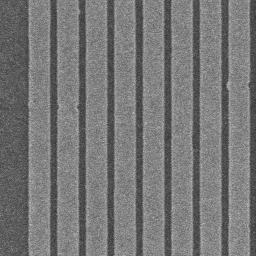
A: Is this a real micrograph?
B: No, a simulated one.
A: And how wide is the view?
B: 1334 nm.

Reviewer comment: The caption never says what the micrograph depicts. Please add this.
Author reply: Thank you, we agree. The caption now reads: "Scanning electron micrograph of parallel lines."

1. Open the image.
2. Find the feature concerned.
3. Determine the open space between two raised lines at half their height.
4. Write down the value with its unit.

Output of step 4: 37.8 nm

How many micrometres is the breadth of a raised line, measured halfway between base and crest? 0.112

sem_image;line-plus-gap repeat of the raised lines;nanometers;149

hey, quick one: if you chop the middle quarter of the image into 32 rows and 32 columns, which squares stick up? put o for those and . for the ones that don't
oooo..ooooo..ooooo..ooooo..ooooo
oooo..ooooo..ooooo..ooooo..ooooo
oooo..ooooo..ooooo..ooooo..ooooo
oooo..ooooo..ooooo..ooooo..ooooo
oooo..ooooo..ooooo..ooooo..ooooo
oooo..ooooo..ooooo..ooooo..ooooo
oooo..ooooo..ooooo..ooooo..ooooo
oooo..ooooo..ooooo..ooooo..ooooo
oooo..ooooo..ooooo..ooooo..ooooo
oooo..ooooo..ooooo..ooooo..ooooo
ooo...ooooo..ooooo..ooooo..ooooo
oooo..ooooo..ooooo..ooooo..ooooo
oooo..ooooo..ooooo..ooooo..ooooo
oooo..ooooo..ooooo..ooooo..ooooo
oooo..ooooo..ooooo..ooooo..ooooo
oooo..ooooo..ooooo..ooooo..ooooo
oooo..ooooo..ooooo..ooooo..ooooo
oooo..ooooo..ooooo..ooooo..ooooo
oooo..ooooo..ooooo..ooooo..ooooo
oooo..ooooo..ooooo..ooooo..ooooo
oooo..ooooo..ooooo..ooooo..ooooo
oooo..ooooo..ooooo..ooooo..ooooo
oooo..ooooo..ooooo..ooooo..ooooo
oooo..ooooo..ooooo..ooooo..ooooo
oooo..ooooo..ooooo..ooooo..ooooo
oooo..ooooo..ooooo..ooooo..ooooo
oooo..ooooo..ooooo..ooooo..ooooo
oooo..ooooo..ooooo..ooooo..ooooo
oooo..ooooo..ooooo..ooooo..ooooo
oooo..ooooo..ooooo..ooooo..ooooo
oooo..ooooo..ooooo..ooooo..ooooo
ooo...ooooo..ooooo..ooooo..ooooo